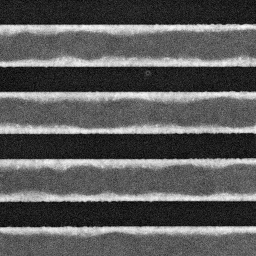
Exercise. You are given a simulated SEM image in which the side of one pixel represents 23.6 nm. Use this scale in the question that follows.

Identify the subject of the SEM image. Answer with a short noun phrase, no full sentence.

lines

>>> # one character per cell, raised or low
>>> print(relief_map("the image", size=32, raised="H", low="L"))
LLLLLLLLLLLLLLLLLLLLLLLLLLLLLLLL
LLLLLLLLLLLLLLLLLLLLLLLLLLLLLLLL
LLLLLLLLLLLLLLLLLLLLLLLLLLLLLLLL
HHHHHHHHHHHHHHHHHHHHHHHHHHHHHHHH
HHHHHHHHHHHHHHHHHHHHHHHHHHHHHHHH
HHHHHHHHHHHHHHHHHHHHHHHHHHHHHHHH
HHHHHHHHHHHHHHHHHHHHHHHHHHHHHHHH
HHHHHHHHHHHHHHHHHHHHHHHHHHHHHHHH
LLLLLLLLLLLLLLLLLLLLLLLLLLLLLLLL
LLLLLLLLLLLLLLLLLLLLLLLLLLLLLLLL
LLLLLLLLLLLLLLLLLLLLLLLLLLLLLLLL
LLLLLLLLLLLLLLLLLLLLLLLLLLLLLLLL
HHHHHHHHHHHHHHHHHHHHHHHHHHHHHHHH
HHHHHHHHHHHHHHHHHHHHHHHHHHHHHHHH
HHHHHHHHHHHHHHHHHHHHHHHHHHHHHHHH
HHHHHHHHHHHHHHHHHHHHHHHHHHHHHHHH
LLLHLLLLLHHHHHHHLLLLLLLLLLLLLHLL
LLLLLLLLLLLLLLLLLLLLLLLLLLLLLLLL
LLLLLLLLLLLLLLLLLLLLLLLLLLLLLLLL
LLLLLLLLLLLLLLLLLLLLLLLLLLLLLLLL
HHHHHHHHHHHHHHHHHHHHHHHHHHHHHHHH
HHHHHHHHHHHHHHHHHHHHHHHHHHHHHHHH
HHHHHHHHHHHHHHHHHHHHHHHHHHHHHHHH
HHHHHHHHHHHHHHHHHHHHHHHHHHHHHHHH
HHHHHHHHHHHHHHHHHHHHHHHHHHHHHHHH
LLLLLLLLLLLLLLLLLLLLLLLLLLLLLLLL
LLLLLLLLLLLLLLLLLLLLLLLLLLLLLLLL
LLLLLLLLLLLLLLLLLLLLLLLLLLLLLLLL
LLLLLLLLLLLLLHHHLLLLLLLLLLLLHHHH
HHHHHHHHHHHHHHHHHHHHHHHHHHHHHHHH
HHHHHHHHHHHHHHHHHHHHHHHHHHHHHHHH
HHHHHHHHHHHHHHHHHHHHHHHHHHHHHHHH